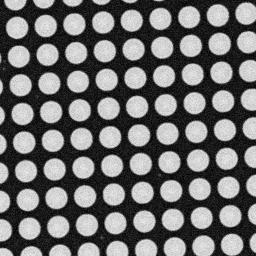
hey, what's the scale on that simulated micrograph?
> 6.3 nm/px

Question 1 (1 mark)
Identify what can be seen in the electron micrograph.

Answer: an array of small figures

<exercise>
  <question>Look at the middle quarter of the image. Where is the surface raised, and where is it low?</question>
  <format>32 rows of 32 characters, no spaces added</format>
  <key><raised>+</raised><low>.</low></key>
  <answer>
........................++.....+
..........++....++++...++++...++
..+++...+++++..+++++...+++++..++
.+++++..+++++..+++++..++++++..++
.+++++..+++++..+++++...++++...++
.+++++...++++...++++....++......
..+++.....+.....................
...............................+
...........+.....+++...++++...++
..++++...++++...+++++..+++++..++
..++++...+++++..+++++..+++++..++
.++++++.++++++..+++++..+++++...+
.+++++...++++...++++....+++.....
..++++....++....................
................................
..................++....++++...+
...+++....+++...+++++..+++++...+
..+++++..+++++..+++++..+++++...+
..+++++..+++++..+++++..+++++...+
..+++++..+++++...++++...++++....
..++++....+++...................
................................
..................++.....+++...+
....++....++++...++++...+++++..+
...++++...++++...+++++..+++++..+
..+++++..++++++..+++++..+++++..+
..+++++...++++...++++...++++....
...++++...++++....++............
....+...........................
.........................+++....
.....+.....+++....++++..+++++..+
...++++...+++++..+++++..+++++..+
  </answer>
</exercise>